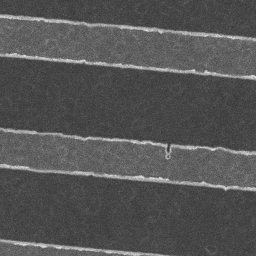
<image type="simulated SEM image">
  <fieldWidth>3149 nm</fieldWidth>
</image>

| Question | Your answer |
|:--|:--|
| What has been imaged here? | one or a few lines or trenches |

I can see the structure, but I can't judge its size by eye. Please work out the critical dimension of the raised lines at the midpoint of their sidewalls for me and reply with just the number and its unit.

481 nm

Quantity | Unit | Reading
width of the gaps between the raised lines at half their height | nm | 906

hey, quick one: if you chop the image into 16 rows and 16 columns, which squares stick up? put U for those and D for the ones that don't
DDDDDDDDDDDDDDDD
UUUUUUDDDDDDDDDD
UUUUUUUUUUUUUUUU
DUUUUUUUUUUUUUUU
DDDDDDDDDDDUUUUU
DDDDDDDDDDDDDDDD
DDDDDDDDDDDDDDDD
DDDDDDDDDDDDDDDD
UUUUDDDDDDDDDDDD
UUUUUUUUUUUUUUUD
DUUUUUUUUUUUUUUU
DDDDDDDDDDDDUUUU
DDDDDDDDDDDDDDDD
DDDDDDDDDDDDDDDD
DDDDDDDDDDDDDDDD
UUUUUDDDDDDDDDDD